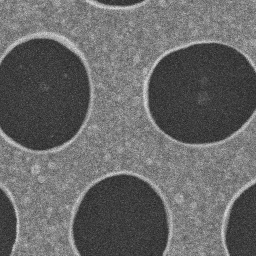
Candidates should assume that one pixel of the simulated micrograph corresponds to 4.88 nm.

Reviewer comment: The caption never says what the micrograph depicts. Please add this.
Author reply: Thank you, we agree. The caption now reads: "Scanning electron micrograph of holes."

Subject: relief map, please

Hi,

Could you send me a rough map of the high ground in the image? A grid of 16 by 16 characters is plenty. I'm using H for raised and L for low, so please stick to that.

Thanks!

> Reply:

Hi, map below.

HHHHHHHHHHHHHHHH
HHHHHHHHHHHHHHHH
HHLHHHHHHHHHHHHH
LLLLLHHHHHLLLLLH
LLLLLLHHHHLLLLLL
LLLLLLHHHLLLLLLL
LLLLLLHHHLLLLLLL
LLLLLHHHHHLLLLLH
LLLLLHHHHHHLLLHH
HHHHHHHHHHHHHHHH
HHHHHHHHHHHHHHHH
HHHHHHLLLHHHHHHH
LHHHHLLLLLHHHHHL
LHHHHLLLLLLHHHLL
LHHHHLLLLLLHHHLL
LHHHHLLLLLHHHHLL